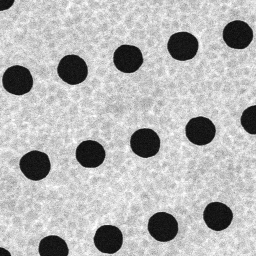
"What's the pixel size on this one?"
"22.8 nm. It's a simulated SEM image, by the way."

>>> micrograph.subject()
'a regular array of holes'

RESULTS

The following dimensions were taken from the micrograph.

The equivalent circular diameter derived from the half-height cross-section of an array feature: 687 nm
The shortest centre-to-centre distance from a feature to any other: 1.28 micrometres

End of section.